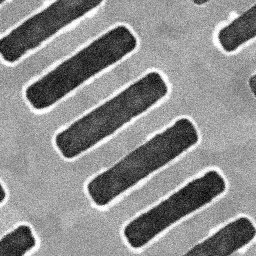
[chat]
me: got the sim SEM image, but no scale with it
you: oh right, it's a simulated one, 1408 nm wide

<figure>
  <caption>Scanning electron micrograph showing holes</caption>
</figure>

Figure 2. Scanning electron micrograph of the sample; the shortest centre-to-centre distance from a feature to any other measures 309 nm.